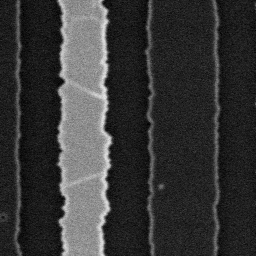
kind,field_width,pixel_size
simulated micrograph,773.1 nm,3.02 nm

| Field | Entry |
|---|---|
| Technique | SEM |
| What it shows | lines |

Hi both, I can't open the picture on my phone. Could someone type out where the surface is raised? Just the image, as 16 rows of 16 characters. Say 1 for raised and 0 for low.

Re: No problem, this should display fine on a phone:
1000110001111100
1000111001111100
1000111001111100
1000111001111100
1000111001111100
1000111001111100
1000111001111100
1000111001111100
1000111001111100
1000111001111100
1000111001111100
1000111001111100
1000111001111100
1000111001111100
1000110001111100
1000110001111100